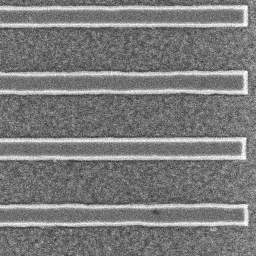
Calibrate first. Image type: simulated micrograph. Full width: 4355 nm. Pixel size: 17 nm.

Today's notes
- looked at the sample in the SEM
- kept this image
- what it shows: one or a few lines or trenches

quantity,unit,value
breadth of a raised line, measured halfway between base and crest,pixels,19.5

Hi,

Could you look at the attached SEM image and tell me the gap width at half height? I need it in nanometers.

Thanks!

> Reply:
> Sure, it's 802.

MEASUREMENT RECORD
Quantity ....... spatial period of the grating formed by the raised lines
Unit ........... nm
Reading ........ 1130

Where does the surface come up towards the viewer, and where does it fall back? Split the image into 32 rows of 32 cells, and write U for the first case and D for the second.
DDDDDDDDDDDDDDDDDDDDDDDDDDDDDDDD
UUUUUUUUUUUUUUUUUUUUUUUUUUUUUUUD
UUUUUUUUUUUUUUUUUUUUUUUUUUUUUUUD
DDDDDDDDDDDDDDDDDDDDDDDDDDDDDDDD
DDDDDDDDDDDDDDDDDDDDDDDDDDDDDDDD
DDDDDDDDDDDDDDDDDDDDDDDDDDDDDDDD
DDDDDDDDDDDDDDDDDDDDDDDDDDDDDDDD
DDDDDDDDDDDDDDDDDDDDDDDDDDDDDDDD
DDDDDDDDDDDDDDDDDDDDDDDDDDDDDDDD
UUUUUUUUUUUUUUUUUUUUUUUUUUUUUUUD
UUUUUUUUUUUUUUUUUUUUUUUUUUUUUUUD
UUUUUUUUUUUUUUUUUUUUUDDUUUUUUUDD
DDDDDDDDDDDDDDDDDDDDDDDDDDDDDDDD
DDDDDDDDDDDDDDDDDDDDDDDDDDDDDDDD
DDDDDDDDDDDDDDDDDDDDDDDDDDDDDDDD
DDDDDDDDDDDDDDDDDDDDDDDDDDDDDDDD
DDDDDDDDDDDDDDDDDDDDDDDDDDDDDDDD
UUUUUUUDUUUUUUUUUUUUUUUUUUUUUUDD
UUUUUUUUUUUUUUUUUUUUUUUUUUUUUUDD
UUUUUUUUUUUUUUUUUUUUUUUUUUUUUUDD
DDDDDDDDDDDDDDDDDDDDDDDDDDDDDDDD
DDDDDDDDDDDDDDDDDDDDDDDDDDDDDDDD
DDDDDDDDDDDDDDDDDDDDDDDDDDDDDDDD
DDDDDDDDDDDDDDDDDDDDDDDDDDDDDDDD
DDDDDDDDDDDDDDDDDDDDDDDDDDDDDDDD
DDDDDDDDDDDDDDDDDDDDDDDDDDDDDDDD
UUUUUUUUUUUUUUUUUUUUUUUUUUUUUUUD
UUUUUUUUUUUUUUUUUUUUUUUUUUUUUUUD
DDDDDDDDDDDDDDDDDDDDDDDDDDDDDDDD
DDDDDDDDDDDDDDDDDDDDDDDDDDDDDDDD
DDDDDDDDDDDDDDDDDDDDDDDDDDDDDDDD
DDDDDDDDDDDDDDDDDDDDDDDDDDDDDDDD